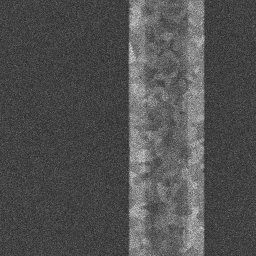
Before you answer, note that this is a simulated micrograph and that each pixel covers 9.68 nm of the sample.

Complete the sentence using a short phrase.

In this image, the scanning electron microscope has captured one or a few lines or trenches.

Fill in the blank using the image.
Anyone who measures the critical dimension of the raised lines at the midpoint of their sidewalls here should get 551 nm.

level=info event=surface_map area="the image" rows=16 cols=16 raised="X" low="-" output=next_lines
---------XXX----
---------XXX----
---------XXX----
---------XXX----
---------XXX----
---------XXX----
---------XXX----
---------XXX----
---------XXX----
---------XXX----
---------XXX----
---------XXX----
---------XXX----
---------XXX----
---------XXX----
---------XXX----